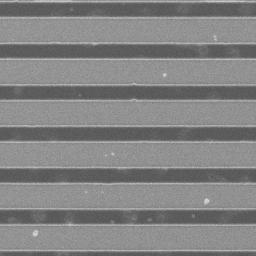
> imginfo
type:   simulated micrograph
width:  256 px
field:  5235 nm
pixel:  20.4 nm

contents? parallel lines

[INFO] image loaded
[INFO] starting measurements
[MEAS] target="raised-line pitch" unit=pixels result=41.5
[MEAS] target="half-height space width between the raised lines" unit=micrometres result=0.498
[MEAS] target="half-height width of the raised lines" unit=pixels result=17.1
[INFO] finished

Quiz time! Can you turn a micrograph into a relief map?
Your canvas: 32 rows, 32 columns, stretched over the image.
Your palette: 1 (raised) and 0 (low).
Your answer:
11111111111111111111111111111111
11111111111111111111111111111111
00000000000000000000000000000000
00000000000000000000000000000000
00000000000000000000000000000000
11111111111111111111111111111111
11111111111111111111111111111111
00000000000000000000000000000000
00000000000000000000000000000000
00000000000000000000000000000000
00000000000000000000000000000000
11111111111111111111111111111111
11111111111111111111111111111111
00000000000000000000000000000000
00000000000000000000000000000000
00000000000000000000000000000000
11111111111111111111111111111111
11111111111111111111111111111111
00000000000000000000000000000000
00000000000000000000000000000000
00000000000000000000000000000000
11111111111111111111111111111111
11111111111111111111111111111111
00000000000000000000000000000000
00000000000000000000000000000000
00000000000000000000000000000000
11111111111111111111111111111111
11111111111111111111111111111111
00000000000000000000000000000000
00000000000000000000000000000000
00000000000000000000000000000000
11111111111111111111111111111111